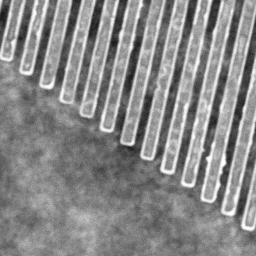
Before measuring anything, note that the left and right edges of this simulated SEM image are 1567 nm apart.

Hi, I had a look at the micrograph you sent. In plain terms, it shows parallel lines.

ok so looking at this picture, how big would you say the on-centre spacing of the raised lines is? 22.7 pixels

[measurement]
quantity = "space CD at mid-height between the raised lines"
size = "56.8 nanometers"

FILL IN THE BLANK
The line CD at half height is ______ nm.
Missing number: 82.2